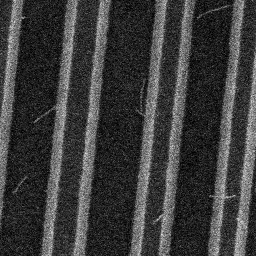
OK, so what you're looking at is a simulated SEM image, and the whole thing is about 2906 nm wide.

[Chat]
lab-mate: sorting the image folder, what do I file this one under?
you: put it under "one or a few lines or trenches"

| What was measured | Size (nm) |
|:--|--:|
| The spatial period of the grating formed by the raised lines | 950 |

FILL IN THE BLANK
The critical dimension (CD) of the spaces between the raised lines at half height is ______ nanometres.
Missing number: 597